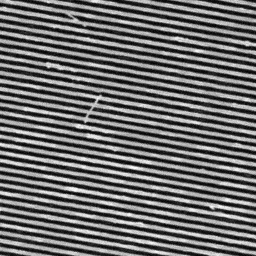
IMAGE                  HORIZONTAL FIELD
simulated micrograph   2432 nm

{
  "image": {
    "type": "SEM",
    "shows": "parallel lines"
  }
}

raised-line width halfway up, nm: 32.8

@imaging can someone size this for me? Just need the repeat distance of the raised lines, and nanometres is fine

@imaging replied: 75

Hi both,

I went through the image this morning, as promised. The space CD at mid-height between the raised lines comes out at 42.1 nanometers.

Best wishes